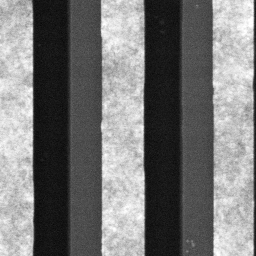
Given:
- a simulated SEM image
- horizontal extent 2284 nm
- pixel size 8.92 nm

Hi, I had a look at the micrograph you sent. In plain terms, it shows lines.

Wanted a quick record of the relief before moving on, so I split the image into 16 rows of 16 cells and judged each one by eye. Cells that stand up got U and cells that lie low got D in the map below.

UUDDUUUUUDDUUUUU
UUDDUUUUUDDUUUUU
UUDDUUUUUDDUUUUU
UUDDUUUUUDDUUUUU
UUDDUUUUUDDUUUUU
UUDDUUUUUDDUUUUU
UUDDUUUUUDDUUUUU
UUDDUUUUUDDUUUUU
UUDDUUUUUDDUUUUU
UUDDUUUUUDDUUUUU
UUDDUUUUUDDUUUUU
UUDDUUUUUDDUUUUU
UUDDUUUUUDDUUUUU
UUDDUUUUUDDUUUUU
UUDDUUUUUDDUUUUU
UUDDUUUUUDDUUUUU